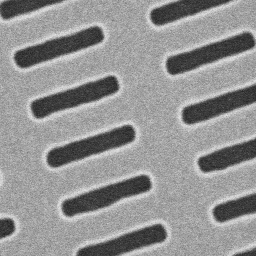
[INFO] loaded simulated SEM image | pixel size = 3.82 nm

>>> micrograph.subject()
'holes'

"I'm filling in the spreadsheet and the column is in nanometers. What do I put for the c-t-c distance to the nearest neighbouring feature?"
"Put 198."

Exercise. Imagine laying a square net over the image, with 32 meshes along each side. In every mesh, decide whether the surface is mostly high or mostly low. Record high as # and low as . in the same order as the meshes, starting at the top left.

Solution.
.......##############.......####
....###############......#######
###################...##########
###########..###################
########.....################...
#####.......##############......
##.......##############........#
##....###############.......####
#####################....#######
#############.##################
###########....#################
#######........##############...
####........##############......
####.....##############.......##
####..#################....#####
#######################.########
#############....###############
##########.......##############.
#######........#############....
######.....##############.......
######...################.....##
#########################..#####
###############....#############
############.......#############
#########........##############.
########......#############.....
########....##############......
..#########################..###
..################...###########
.##############......###########
############........############
##########......##############..